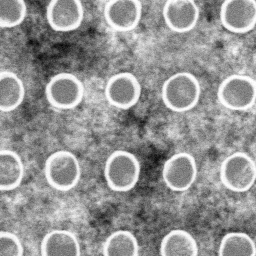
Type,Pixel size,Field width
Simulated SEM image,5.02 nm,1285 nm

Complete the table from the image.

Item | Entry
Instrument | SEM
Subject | raised bodies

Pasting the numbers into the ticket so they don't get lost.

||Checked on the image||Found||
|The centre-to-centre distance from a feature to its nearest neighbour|293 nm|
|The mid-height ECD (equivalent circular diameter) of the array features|0.169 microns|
